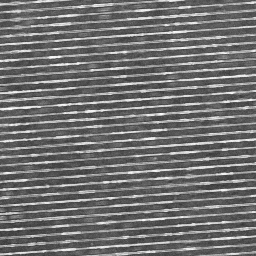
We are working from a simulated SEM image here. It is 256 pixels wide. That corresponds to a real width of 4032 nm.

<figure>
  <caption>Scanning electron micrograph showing parallel lines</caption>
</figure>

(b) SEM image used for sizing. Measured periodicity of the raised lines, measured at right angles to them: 127 nm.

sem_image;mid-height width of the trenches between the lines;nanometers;100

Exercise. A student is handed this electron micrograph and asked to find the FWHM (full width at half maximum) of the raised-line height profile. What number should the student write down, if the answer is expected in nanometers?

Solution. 23.6